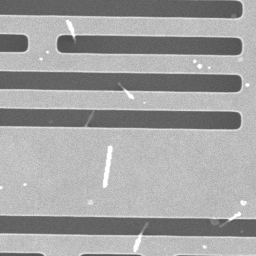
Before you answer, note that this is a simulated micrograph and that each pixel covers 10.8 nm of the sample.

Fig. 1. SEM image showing groups of lines, slits or small figures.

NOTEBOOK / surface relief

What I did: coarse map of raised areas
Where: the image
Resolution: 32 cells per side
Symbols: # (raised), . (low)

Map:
..............................##
..............................##
################################
################################
...#####.................#######
....###.......................##
...#####......................##
################################
################################
..............................##
..............................##
########################.....###
################################
.###############################
..............................##
..............................##
################################
################################
################################
################################
################################
################################
################################
################################
################################
################################
################################
................................
................................
##############...#..............
################################
################################